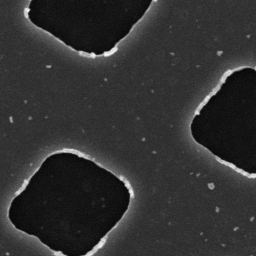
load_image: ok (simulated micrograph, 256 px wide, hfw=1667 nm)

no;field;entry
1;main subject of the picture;holes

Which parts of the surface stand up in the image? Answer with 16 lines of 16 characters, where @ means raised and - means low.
@@-------@@@@@@@
@@------@@@@@@@@
@@@@----@@@@@@@@
@@@@@@@@@@@@@@@@
@@@@@@@@@@@@@@@-
@@@@@@@@@@@@@@--
@@@@@@@@@@@@@---
@@@@@@@@@@@@----
@@@@@@@@@@@@----
@@@@@@@@@@@@@---
@@-----@@@@@@@@-
@@------@@@@@@@@
@-------@@@@@@@@
@-------@@@@@@@@
@@-----@@@@@@@@@
@@@---@@@@@@@@@@